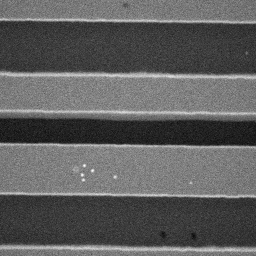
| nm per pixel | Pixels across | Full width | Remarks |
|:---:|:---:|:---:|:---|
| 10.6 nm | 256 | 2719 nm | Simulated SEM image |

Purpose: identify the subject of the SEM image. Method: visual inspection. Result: lines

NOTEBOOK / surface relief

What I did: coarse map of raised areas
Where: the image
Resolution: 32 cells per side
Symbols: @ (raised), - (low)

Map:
@@@@@@@@@@@@@@@@@@@@@@@@@@@@@@@@
@@@@@@@@@@@@@@@@@@@@@@@@@@@@@@@@
----------@@@@@@@@@@@@@@@@@@@@@@
--------------------------------
--------------------------------
--------------------------------
--------------------------------
--------------------------------
--------------------------------
@@@@@@@@@@@@@@@@----------------
@@@@@@@@@@@@@@@@@@@@@@@@@@@@@@@@
@@@@@@@@@@@@@@@@@@@@@@@@@@@@@@@@
@@@@@@@@@@@@@@@@@@@@@@@@@@@@@@@@
@@@@@@@@@@@@@@@@@@@@@@@@@@@@@@@@
--------------------------------
--------------------------------
--------------------------------
--------------------------------
@@@@@@@@@@@@@@@@@@@@@@@@@@@@@@@@
@@@@@@@@@@@@@@@@@@@@@@@@@@@@@@@@
@@@@@@@@@@@@@@@@@@@@@@@@@@@@@@@@
@@@@@@@@@@@@@@@@@@@@@@@@@@@@@@@@
@@@@@@@@@@@@@@@@@@@@@@@@@@@@@@@@
@@@@@@@@@@@@@@@@@@@@@@@@@@@@@@@@
-------------------------@@@@@@@
--------------------------------
--------------------------------
--------------------------------
--------------------------------
--------------------------------
--------------------------------
@@@@@@@@@@@@@@@@@@@@@@@@@@@@@@@@